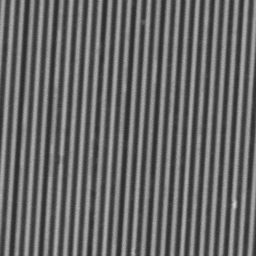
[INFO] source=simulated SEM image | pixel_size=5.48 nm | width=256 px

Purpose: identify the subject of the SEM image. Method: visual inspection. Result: parallel lines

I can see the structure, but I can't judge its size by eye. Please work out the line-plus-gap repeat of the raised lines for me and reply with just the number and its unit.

0.0533 micrometres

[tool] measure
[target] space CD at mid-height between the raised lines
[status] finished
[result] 30.1 nm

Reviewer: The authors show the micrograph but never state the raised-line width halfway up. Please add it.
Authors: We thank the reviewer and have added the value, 0.0246 µm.